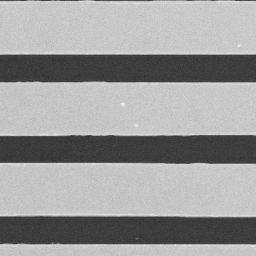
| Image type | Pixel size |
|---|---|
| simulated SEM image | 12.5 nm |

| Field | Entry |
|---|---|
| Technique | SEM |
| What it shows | lines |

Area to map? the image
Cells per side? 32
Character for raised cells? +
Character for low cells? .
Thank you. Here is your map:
++++++++++++++++++++++++++++++++
++++++++++++++++++++++++++++++++
++++++++++++++++++++++++++++++++
++++++++++++++++++++++++++++++++
++++++++++++++++++++++++++++++++
++++++++++++++++++++++++++++++++
++++++++++++++++++++++++++++++++
................................
................................
................................
++++++++++++++++++++++++++++++++
++++++++++++++++++++++++++++++++
++++++++++++++++++++++++++++++++
++++++++++++++++++++++++++++++++
++++++++++++++++++++++++++++++++
++++++++++++++++++++++++++++++++
++++++++++++++++++++++++++++++++
................................
................................
................................
+++++++++++++++++++++...++......
++++++++++++++++++++++++++++++++
++++++++++++++++++++++++++++++++
++++++++++++++++++++++++++++++++
++++++++++++++++++++++++++++++++
++++++++++++++++++++++++++++++++
++++++++++++++++++++++++++++++++
................................
................................
................................
................................
++++++++++++++++++++++++++++++++